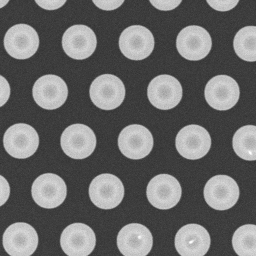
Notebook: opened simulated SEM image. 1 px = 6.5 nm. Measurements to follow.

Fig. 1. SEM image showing an array of small figures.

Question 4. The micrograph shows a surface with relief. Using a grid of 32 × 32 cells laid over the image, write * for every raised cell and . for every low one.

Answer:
*....***....***....***....****..
................................
................................
.***.....**.....**.....**.....**
.****...****...****...****...***
*****...****...****...****...***
.***....****...****...****...***
........................*......*
................................
.....**.....**......*......**...
*...****...****....****...****..
*...****...*****..*****...****..
*...****...****....****...****..
.....**.....**......**.....**...
................................
..*......*......................
.****...****...****...****...***
*****...****...****...****...***
.****...****...****...****...***
.***.....**.....**.....**.....**
................................
................................
*...****....***....***....***...
*...****...****...*****...****..
*...****...****...*****...****..
.....***....***....***....***...
................................
................................
.***....***....***.....***....**
*****...****...****...****...***
*****...****...****...****...***
.***....***....****...****...***